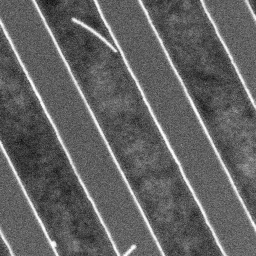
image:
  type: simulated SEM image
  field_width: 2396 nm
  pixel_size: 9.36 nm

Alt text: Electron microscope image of lines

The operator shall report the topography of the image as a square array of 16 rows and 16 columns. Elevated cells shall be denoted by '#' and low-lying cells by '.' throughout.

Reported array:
##....###....###
###....###...###
.##....###....##
.###....###...##
..##....###....#
..###....###...#
...##....###....
...###....###...
....##....###...
....###....###..
#....##....###..
#....###....###.
##....###...###.
##....###....###
###....###...###
.##....###....##